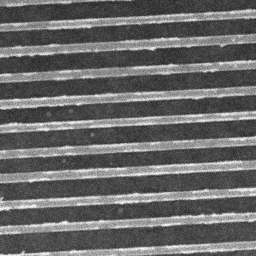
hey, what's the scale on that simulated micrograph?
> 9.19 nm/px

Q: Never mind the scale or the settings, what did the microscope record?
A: parallel lines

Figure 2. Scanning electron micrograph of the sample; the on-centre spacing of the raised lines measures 0.234 um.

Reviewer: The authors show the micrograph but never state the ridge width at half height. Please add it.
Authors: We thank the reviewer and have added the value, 72.3 nanometres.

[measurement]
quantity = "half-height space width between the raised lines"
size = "0.16 microns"